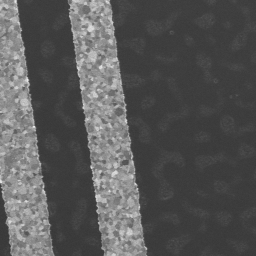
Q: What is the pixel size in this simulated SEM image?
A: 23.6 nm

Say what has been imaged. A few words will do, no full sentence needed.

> one or a few lines or trenches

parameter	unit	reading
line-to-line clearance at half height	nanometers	1190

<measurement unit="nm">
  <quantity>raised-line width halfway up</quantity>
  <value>976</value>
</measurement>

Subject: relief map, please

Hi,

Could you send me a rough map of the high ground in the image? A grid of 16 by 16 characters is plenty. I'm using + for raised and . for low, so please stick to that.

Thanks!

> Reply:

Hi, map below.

+...+++.........
+...+++.........
+....++.........
++...++.........
++...++.........
++...+++........
++...+++........
++...+++........
++...+++........
++....++........
+++...++........
+++...+++.......
+++...+++.......
+++...+++.......
.++...+++.......
.++...+++.......